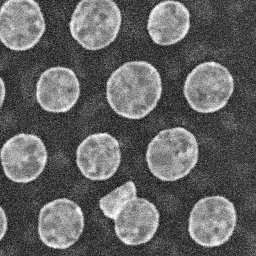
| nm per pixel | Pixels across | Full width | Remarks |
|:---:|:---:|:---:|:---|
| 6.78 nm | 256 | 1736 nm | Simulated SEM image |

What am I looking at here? a regular array of raised bodies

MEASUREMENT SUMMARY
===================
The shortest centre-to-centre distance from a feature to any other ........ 0.507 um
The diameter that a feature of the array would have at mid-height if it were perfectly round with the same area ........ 318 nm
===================